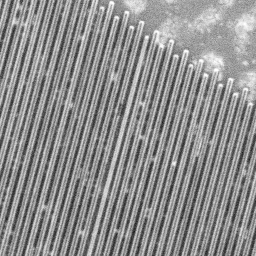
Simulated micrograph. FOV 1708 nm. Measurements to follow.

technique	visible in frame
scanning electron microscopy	parallel lines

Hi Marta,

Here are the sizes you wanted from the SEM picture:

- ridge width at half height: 24.2 nm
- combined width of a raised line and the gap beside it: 56.1 nm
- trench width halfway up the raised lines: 0.0306 um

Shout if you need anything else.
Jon